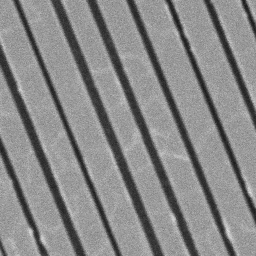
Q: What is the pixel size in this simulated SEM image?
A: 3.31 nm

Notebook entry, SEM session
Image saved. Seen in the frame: parallel lines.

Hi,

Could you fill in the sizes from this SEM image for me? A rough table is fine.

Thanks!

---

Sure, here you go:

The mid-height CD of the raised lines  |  91.7 nm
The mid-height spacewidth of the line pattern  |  24.6 nm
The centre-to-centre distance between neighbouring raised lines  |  117 nanometres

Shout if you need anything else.